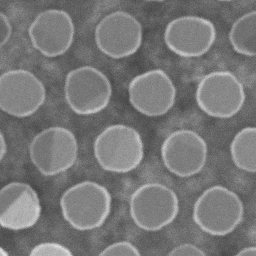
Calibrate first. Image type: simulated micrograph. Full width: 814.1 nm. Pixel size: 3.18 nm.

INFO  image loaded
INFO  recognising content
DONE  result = a regular array of raised bodies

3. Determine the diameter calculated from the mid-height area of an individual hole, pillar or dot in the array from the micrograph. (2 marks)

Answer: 45.3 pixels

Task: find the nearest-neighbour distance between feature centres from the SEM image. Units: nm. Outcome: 204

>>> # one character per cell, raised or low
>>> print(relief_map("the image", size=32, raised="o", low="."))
................................
......oo........................
o...ooooo....oooo.....ooo.....oo
o...ooooo...oooooo...oooooo..ooo
o...ooooo...oooooo...oooooo..ooo
....ooooo...ooooo....ooooo...ooo
.....ooo.....oooo.....oooo....oo
................................
..........o.....................
oooo.....oooo.....ooo.....ooo...
ooooo...oooooo..oooooo...ooooo..
oooooo..oooooo..oooooo...ooooo..
ooooo...oooooo..oooooo...ooooo..
ooooo....oooo....oooo....ooooo..
...........................oo...
................................
.....oooo....oooo.....oo......oo
....ooooo...ooooo....oooo....ooo
o...oooooo..oooooo..oooooo...ooo
....ooooo...oooooo..oooooo...ooo
....ooooo....oooo....oooo.....oo
.....oo...............ooo.......
................................
oooo.....oooo.....ooo......o....
oooo....ooooo....ooooo...ooooo..
ooooo...oooooo..oooooo...ooooo..
ooooo...ooooo....ooooo..oooooo..
ooooo....oooo....oooo....ooooo..
.oo.......o.......oo.....oooo...
................................
.....o........oo................
....ooooo....oooo....oooo.....oo